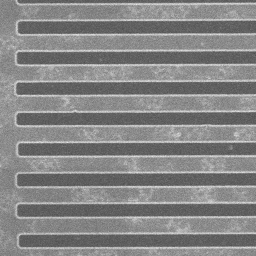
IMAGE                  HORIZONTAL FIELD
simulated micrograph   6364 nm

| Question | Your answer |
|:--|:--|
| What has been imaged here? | parallel lines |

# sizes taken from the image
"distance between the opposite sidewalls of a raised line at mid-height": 416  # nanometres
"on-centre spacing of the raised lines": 758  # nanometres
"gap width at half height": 14.3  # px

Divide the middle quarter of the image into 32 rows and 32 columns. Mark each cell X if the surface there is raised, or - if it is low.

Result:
XXXXXXXXXXXXXXXXXXXXXXXXXXXXXXXX
XXXXXXXXXXXXXXXXXXXXXXXXXXXXXXXX
XXXXXXXXXXXXXXXXXXXXXXXXXXXXXXXX
XXXXXXXXXXXXXXXXXXXXXXXXXXXXXXXX
--------------------------------
--------------------------------
--------------------------------
--------------------------------
XXXXXXXXXXXXXXXXXXXXXXXXXXXXXXXX
XXXXXXXXXXXXXXXXXXXXXXXXXXXXXXXX
XXXXXXXXXXXXXXXXXXXXXXXXXXXXXXXX
XXXXXXXXXXXXXXXXXXXXXXXXXXXXXXXX
--------------------------------
--------------------------------
--------------------------------
---------------XXXXXXXXXXXXXXXXX
XXXXXXXXXXXXXXXXXXXXXXXXXXXXXXXX
XXXXXXXXXXXXXXXXXXXXXXXXXX--XXXX
XXXXXXXXXXXXXXXXXXXXXXXXXXXXXXXX
XX------------------------------
--------------------------------
--------------------------------
--------------------------------
XXXXXXXXXXXXXXXXXXXXXXXXXXXXXXXX
XXXXXXXXXXXXXXXXXXXXXXXXXXXXXXXX
XXXXXXXXXXXXXXXXXXXXXXXXXXXXXXXX
XXXXXXXXXXXXXXXXXXXXXXXXXXXXXXXX
--------------------------------
--------------------------------
--------------------------------
--------------------------------
XXXXXXXXXXXXXXXXXXXXXXXXXXXXXXXX